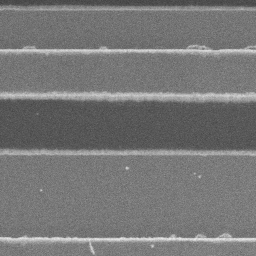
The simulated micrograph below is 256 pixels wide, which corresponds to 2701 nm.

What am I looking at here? lines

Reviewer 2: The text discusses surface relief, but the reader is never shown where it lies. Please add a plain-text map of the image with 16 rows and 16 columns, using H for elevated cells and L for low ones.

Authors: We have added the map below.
LLLLLLLLLLLLLLLL
HHHHHHHHHHHHHHHH
HHHHHHHHHHHHHHHH
HHHHHHHHHHHHHHHH
HHHHHHHHHHHHHHHH
HHHHHHHHHHHHHHHH
LLLLLLLLLLLLLLLL
LLLLLLLLLLLLLLLL
LLLLLLLLLLLLLLLL
LLLLLLLLLLLLLLLL
HHHHHHHHHHHHHHHH
HHHHHHHHHHHHHHHH
HHHHHHHHHHHHHHHH
HHHHHHHHHHHHHHHH
HHHHHHHHHHHHHHHH
HHHHHHHHHHHHHHHH